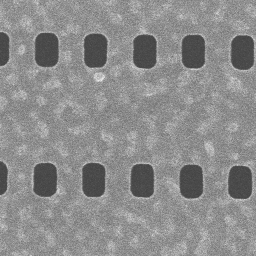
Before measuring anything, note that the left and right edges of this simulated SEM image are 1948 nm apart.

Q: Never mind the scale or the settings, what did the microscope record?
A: a regular array of holes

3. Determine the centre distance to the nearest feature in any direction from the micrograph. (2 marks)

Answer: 370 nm